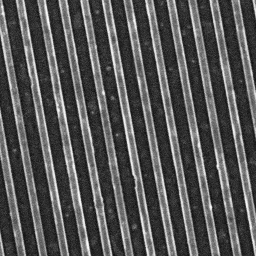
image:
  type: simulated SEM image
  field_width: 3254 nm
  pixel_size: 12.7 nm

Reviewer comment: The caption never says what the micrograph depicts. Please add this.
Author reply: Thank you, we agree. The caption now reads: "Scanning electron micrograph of parallel lines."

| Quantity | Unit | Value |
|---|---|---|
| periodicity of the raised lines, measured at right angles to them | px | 21.2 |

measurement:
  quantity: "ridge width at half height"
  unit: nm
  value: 92.3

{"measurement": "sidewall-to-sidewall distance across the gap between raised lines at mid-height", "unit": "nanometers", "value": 175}